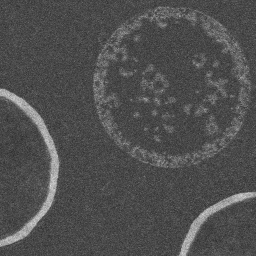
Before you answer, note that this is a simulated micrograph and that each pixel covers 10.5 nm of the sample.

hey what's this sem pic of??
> raised bodies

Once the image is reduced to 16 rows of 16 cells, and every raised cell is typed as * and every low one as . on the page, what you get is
................
................
................
................
................
................
*...............
**..............
***.............
***.............
***.............
***.............
***............*
**...........***
*...........****
............****